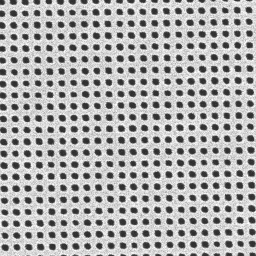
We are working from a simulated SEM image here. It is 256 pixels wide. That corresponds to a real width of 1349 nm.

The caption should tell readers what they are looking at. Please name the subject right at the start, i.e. a regular array of holes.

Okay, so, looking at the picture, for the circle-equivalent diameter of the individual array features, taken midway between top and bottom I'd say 38.5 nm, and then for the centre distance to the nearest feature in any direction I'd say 60.9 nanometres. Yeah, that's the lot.